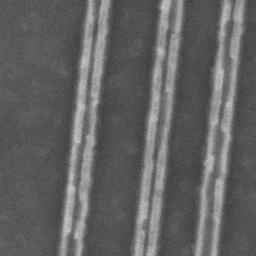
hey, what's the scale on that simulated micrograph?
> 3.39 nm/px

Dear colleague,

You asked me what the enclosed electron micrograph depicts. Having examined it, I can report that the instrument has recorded one or a few lines or trenches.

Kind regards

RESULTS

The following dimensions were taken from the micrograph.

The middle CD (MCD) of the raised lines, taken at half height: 57.8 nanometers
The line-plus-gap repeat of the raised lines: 0.228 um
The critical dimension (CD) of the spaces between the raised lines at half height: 0.165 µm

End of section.